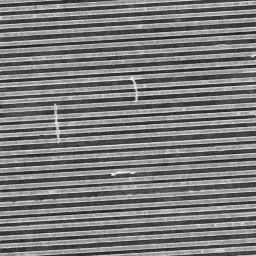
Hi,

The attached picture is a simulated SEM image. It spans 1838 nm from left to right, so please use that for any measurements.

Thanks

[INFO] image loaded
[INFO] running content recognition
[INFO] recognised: parallel lines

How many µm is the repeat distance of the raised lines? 0.0607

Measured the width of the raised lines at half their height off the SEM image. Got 30.5 nm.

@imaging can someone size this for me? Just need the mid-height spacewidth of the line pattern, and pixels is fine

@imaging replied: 4.25